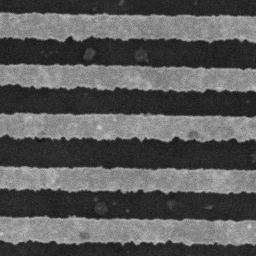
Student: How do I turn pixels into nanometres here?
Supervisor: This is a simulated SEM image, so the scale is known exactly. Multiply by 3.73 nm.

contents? lines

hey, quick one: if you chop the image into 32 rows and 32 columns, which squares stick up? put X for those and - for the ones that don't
--------------------------------
--------------------------------
XXXXXXXXXXXXXXXXXXXXXXXXXXXXXXXX
XXXXXXXXXXXXXXXXXXXXXXXXXXXXXXXX
XXXXXXXXXXXXXXXXXXXXXXXXXXXXXXXX
--------------------------------
--------------------------------
--------------------------------
XXXXXXXXXXXXXXXXXXXXXXXX-X------
XXXXXXXXXXXXXXXXXXXXXXXXXXXXXXXX
X-XXXXXXXXXXXXXXXXXXXXXXXXXXXXXX
--------------------------------
--------------------------------
--------------------------------
XXXXXXXXXXXXXXXXXX--X-----------
XXXXXXXXXXXXXXXXXXXXXXXXXXXXXXXX
XXXXXXXXXXXXXXXXXXXXXXXXXXXXXXXX
--------------------X----X-X--X-
--------------------------------
--------------------------------
--------------------------------
XXXXXXXXXXXXXXXXXXXXXXXXXXXXXXXX
XXXXXXXXXXXXXXXXXXXXXXXXXXXXXXXX
XXXXXXXXXXXXXXXXXXXXXXXXXXXXXXXX
--------------------------------
--------------------------------
--------------------------------
XXXXXXXXXXXX--XXX--X---X--------
XXXXXXXXXXXXXXXXXXXXXXXXXXXXXXXX
XXXXXXXXXXXXXXXXXXXXXXXXXXXXXXXX
-----------------------X----XX-X
--------------------------------